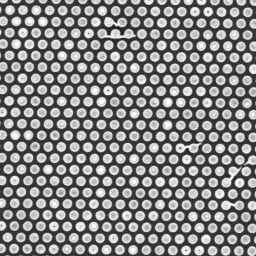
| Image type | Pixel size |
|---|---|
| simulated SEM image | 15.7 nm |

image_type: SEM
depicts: a regular array of raised bodies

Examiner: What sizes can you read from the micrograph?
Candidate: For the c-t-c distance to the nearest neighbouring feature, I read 204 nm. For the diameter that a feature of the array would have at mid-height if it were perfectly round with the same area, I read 142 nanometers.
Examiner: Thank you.